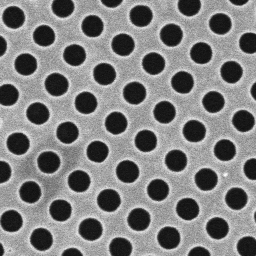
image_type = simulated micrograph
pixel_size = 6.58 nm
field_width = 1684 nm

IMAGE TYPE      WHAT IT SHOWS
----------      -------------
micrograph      a regular array of holes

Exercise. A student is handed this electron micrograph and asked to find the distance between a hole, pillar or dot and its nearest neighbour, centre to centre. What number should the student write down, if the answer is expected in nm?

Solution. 227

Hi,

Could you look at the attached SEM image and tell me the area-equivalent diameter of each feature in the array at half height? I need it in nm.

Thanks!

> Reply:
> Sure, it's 143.